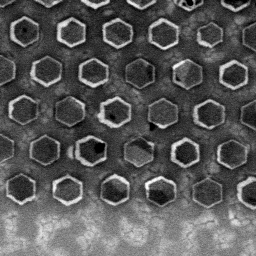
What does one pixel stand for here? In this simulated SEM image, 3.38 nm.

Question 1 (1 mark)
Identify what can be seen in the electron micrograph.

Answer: a regular array of raised bodies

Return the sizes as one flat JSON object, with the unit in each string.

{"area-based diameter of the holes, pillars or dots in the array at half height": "0.0987 micrometres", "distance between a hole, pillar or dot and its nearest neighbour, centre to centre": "153 nm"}